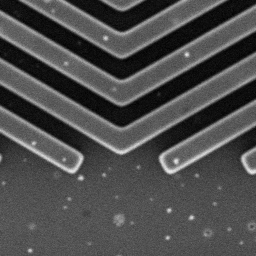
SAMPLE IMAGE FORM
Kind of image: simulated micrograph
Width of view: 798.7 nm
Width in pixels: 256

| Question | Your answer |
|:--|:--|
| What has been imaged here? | groups of lines, slits or small figures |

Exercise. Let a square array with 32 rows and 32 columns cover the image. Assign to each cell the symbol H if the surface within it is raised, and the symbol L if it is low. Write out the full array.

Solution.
LLLHHHHHHLLLLHHHHLLLLLHHHHHLLLLL
LLLLLHHHHHLLLLLLLLLLHHHHHHLLLLHH
HHLLLLLHHHHHLLLLLLHHHHHHLLLLLHHH
HHHHLLLLHHHHHHLLLHHHHHLLLLLHHHHH
HHHHHLLLLLHHHHHHHHHHLLLLLHHHHHHL
LLHHHHHLLLLLHHHHHHHLLLLHHHHHHLLL
LLLHHHHHHLLLLLHHHLLLLLHHHHHLLLLL
LLLLLHHHHHLLLLLLLLLLHHHHHHLLLLHH
HHLLLLLHHHHHLLLLLLHHHHHHLLLLLHHH
HHHHLLLLHHHHHHLLHHHHHHLLLLLHHHHH
HHHHHLLLLLHHHHHHHHHHLLLLLHHHHHHL
LLHHHHHLLLLLHHHHHHHLLLLHHHHHHLLL
LLLHHHHHHLLLLLHHHLLLLLHHHHHLLLLL
LLLLLHHHHHHLLLLLLLLLHHHHHLLLLLHH
HHLLLLLHHHHHLLLLLLHHHHHHLLLLHHHH
HHHHLLLLHHHHHHLLHHHHHHLLLLLHHHHH
HHHHHHLLLLHHHHHHHHHHLLLLLHHHHHHL
LLHHHHHLLLLLHHHHHHLLLLLHHHHHHLLL
LLLHHHHHHLLLLLHHHLLLLHHHHHHLLLLL
LLLLLHHHHHLLLLLLLLLLHHHHHLLLLLHH
LLLLLLLHHHLLLLLLLLLLHHHHLLLLLLHH
LLLLLLLLLLLLLLLLLLLLLHLLLLLLLLLH
LLLLLLLLLLLLLLLLLLLLLLLLLLLLLLLL
LLLLLLLLLLLLLLLLLLLLLLLLLLLLLLLL
LLLLLLLLLLLLLLLLLLLLLLLLLLLLLLLL
LLLLLLLLLLLLLLLLLLLLLLLLLLLLLLLL
LLLLLLLLLLLLLLLLLLLLLLLLLLLLLLLL
LLLLLLLLLLLLLLLLLLLLLLLLLLLLLLLL
LLLLLLLLLLLLLLLLLLLLLLLLLLLLLLLL
LLLLLLLLLLLLLLLLLLLLLLLLLLLLLLLL
LLLLLLLLLLLLLLLLLLLLLLLLLLLLLLLL
LLLLLLLLLLLLLLLLLLLLLLLLLLLLLLLL